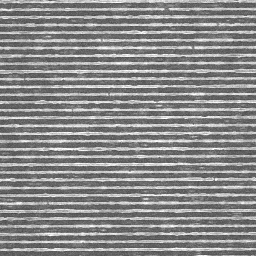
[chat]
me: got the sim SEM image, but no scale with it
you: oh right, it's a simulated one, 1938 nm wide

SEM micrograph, parallel lines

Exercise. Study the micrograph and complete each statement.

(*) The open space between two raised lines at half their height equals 41.6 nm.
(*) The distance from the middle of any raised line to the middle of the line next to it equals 58.7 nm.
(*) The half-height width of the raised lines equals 0.0142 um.